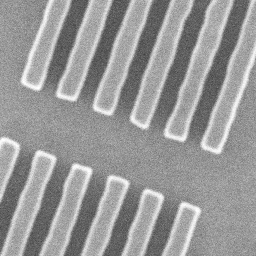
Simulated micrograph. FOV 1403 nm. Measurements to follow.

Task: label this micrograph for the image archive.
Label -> groups of lines, slits or small figures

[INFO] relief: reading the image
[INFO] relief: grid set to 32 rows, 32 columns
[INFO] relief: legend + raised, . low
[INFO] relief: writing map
......+++..+++..+++..+++..+++..+
......++...++...++...+++..+++..+
.....+++..+++..+++...++...++...+
.....+++..+++..+++..+++..+++..++
.....++...++...++...++...+++..++
....+++..+++..+++...++...++...++
....+++..+++..+++..+++..+++..+++
....++...++...++...+++..+++..+++
...+++..+++..+++..+++...++...++.
...+++..+++..+++..+++..+++..+++.
...++...++...++...++...++...+++.
.......+++..+++..+++...++...++..
............+++..+++..+++..+++..
............++...++...++...++...
.................++..+++..+++...
.................+...+++..+++...
.....................++...++....
+........................+++....
++........................++....
++..++..........................
++..+++.........................
+...++...++.....................
+...++..+++...+.................
+..+++..+++..+++................
...++...++...++...++............
..+++...++...++...++............
..+++..+++..+++..+++..+++.......
..++...++...++...++...++........
.+++..+++..+++..+++...++........
.+++..+++..+++..+++..+++........
.++...++...++...++...++.........
+++..+++..+++..+++...++.........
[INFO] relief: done